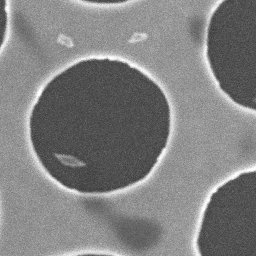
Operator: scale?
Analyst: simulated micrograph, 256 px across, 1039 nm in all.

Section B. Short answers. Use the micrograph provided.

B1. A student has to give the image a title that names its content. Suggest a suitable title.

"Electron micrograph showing holes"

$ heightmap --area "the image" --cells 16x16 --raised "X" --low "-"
XXXXXXXXXXXXXX--
XXXXXXXXXXXXX---
XXXXXXXXXXXXX---
XXXXXXXXXXXXX---
XXXX-----XXXX---
XXX-------XXXX--
XX---------XXXX-
XX---------XXXXX
XX---------XXXXX
XX--------XXXXXX
XXX-------XXXXXX
XXXX----XXXXXX--
XXXXXXXXXXXXX---
XXXXXXXXXXXXX---
XXXXXXXXXXXX----
XXXXXXXXXXXX----